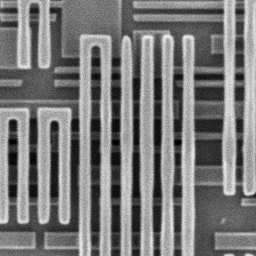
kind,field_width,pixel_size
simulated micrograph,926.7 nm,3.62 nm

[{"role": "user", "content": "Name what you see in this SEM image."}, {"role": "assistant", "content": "wiring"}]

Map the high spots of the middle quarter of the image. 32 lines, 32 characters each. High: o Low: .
....ooo..ooo..ooo..ooo...oo...oo
....ooo..ooo..ooo..ooo...oo...oo
....ooo..ooo..ooo..ooo...oo...oo
....ooo..oo...ooo..ooo...oo...oo
....ooo..oo...ooo..ooo...oo...oo
....ooo..oo...ooo..ooo...oo...oo
....ooo..oo...ooo..ooo...oo...oo
....ooo..oo...ooo..ooo...oo...oo
....ooo..oo...ooo..ooo...oo...oo
....ooo..ooo..ooo..ooo...oo...oo
....ooo..ooo..ooo..ooo...oo...oo
oo..ooo..ooo..ooo..ooo...oo...oo
oo..ooo..ooo..ooo..ooo...oo...oo
oo..ooo..ooo..ooo..ooo...oo...oo
oo..ooo..ooo..ooo..ooo...oo...oo
oo..oo...ooo..ooo..ooo...oo...oo
o...oo...ooo..ooo..ooo...oo...oo
o...oo...ooo..ooo..ooo...oo...oo
o...oo...ooo..ooo..ooo...oo...oo
o...ooo..ooo..ooo..ooo...oo...oo
o...ooo..ooo..ooo..ooo...oo...oo
o...ooo..oo...ooo..ooo...oo..ooo
o...ooo..oo...ooo..ooo..ooo..ooo
o...ooo..oo...ooo..ooo..ooo..ooo
o...ooo..oo...ooo..ooo..ooo..ooo
o...ooo..oo...ooo..ooo..ooo..ooo
o...ooo..oo...ooo..ooo..ooo..ooo
o...ooo..oo...ooo..ooo..ooo..ooo
o...ooo..oo...ooo..ooo..ooo...oo
o...ooo..oo...ooo..ooo...oo...oo
o...ooo..oo...ooo..ooo...oo...oo
o...ooo..oo...ooo..ooo...oo...oo